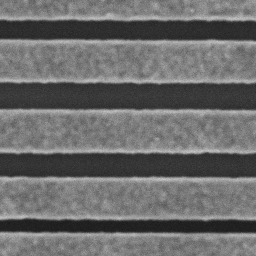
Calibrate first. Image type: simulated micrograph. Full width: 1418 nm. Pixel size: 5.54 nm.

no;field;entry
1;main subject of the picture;lines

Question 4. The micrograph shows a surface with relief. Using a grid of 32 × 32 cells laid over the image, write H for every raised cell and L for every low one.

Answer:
HHHHHHHHHHHHHHHHHHHHHHHHHHHHHHHH
HHHHHHHHHHHHHHHHHHHHHHHHHHHHHHHH
LLLLLLLLLLLLLLLHHLLLHLLLLLHLHHHH
LLLLLLLLLLLLLLLLLLLLLLLLLLLLLLLL
LLLLLLLLLLLLLLLLLLLLLLLLLLLLLLLL
HHHHHHHHHHHHHHHHHHHHHHHHHHHHHHHH
HHHHHHHHHHHHHHHHHHHHHHHHHHHHHHHH
HHHHHHHHHHHHHHHHHHHHHHHHHHHHHHHH
HHHHHHHHHHHHHHHHHHHHHHHHHHHHHHHH
HHHHHHHHHHHHHHHHHHHHHHHHHHHHHHHH
LLLLLLLLLLLLLLLLLLLLLLLLLLLLLLLL
LLLLLLLLLLLLLLLLLLLLLLLLLLLLLLLL
LLLLLLLLLLLLLLLLLLLLLLLLLLLLLLLL
LLLLLLLLLLLLLLLLLLLLLLLLLLLLLLLL
HHHHHHHHHHHHHHHHHHHHHHHHHHHHHHHH
HHHHHHHHHHHHHHHHHHHHHHHHHHHHHHHH
HHHHHHHHHHHHHHHHHHHHHHHHHHHHHHHH
HHHHHHHHHHHHHHHHHHHHHHHHHHHHHHHH
HHHHHHHHHHHHHHHHHHHHHHHHHHHHHHHH
LLLLLLLLLLLLLLLLLLLLLLLLLLLLLLLL
LLLLLLLLLLLLLLLLLLLLLLLLLLLLLLLL
LLLLLLLLLLLLLLLLLLLLLLLLLLLLLLLL
HHHHHHHHHHHHHHHHHHHHHHHHHHHHHHHH
HHHHHHHHHHHHHHHHHHHHHHHHHHHHHHHH
HHHHHHHHHHHHHHHHHHHHHHHHHHHHHHHH
HHHHHHHHHHHHHHHHHHHHHHHHHHHHHHHH
HHHHHHHHHHHHHHHHHHHHHHHHHHHHHHHH
LLLLLLLLLLLLLLLLLLLLLLLLLHLLLLLL
LLLLLLLLLLLLLLLLLLLLLLLLLLLLLLLL
HHHHHHHHHHHHHHHHHHHHHHHHHHHHHHHH
HHHHHHHHHHHHHHHHHHHHHHHHHHHHHHHH
HHHHHHHHHHHHHHHHHHHHHHHHHHHHHHHH